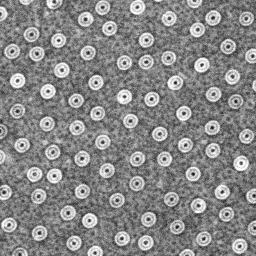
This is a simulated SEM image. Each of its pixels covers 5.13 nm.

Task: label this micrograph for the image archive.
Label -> a regular array of ring-shaped raised bodies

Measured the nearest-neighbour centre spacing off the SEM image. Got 129 nm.